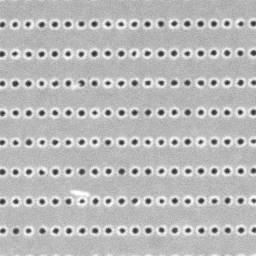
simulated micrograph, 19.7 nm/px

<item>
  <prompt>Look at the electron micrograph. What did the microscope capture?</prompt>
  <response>a regular array of holes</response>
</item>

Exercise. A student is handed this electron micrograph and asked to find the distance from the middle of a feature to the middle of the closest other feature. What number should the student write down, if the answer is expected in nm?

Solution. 256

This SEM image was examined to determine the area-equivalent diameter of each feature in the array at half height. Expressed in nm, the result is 137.